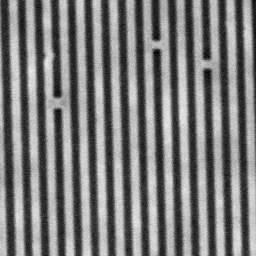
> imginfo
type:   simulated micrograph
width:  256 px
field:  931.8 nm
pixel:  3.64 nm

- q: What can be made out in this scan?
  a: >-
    parallel lines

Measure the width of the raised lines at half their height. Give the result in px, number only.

6.62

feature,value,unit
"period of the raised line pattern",0.0608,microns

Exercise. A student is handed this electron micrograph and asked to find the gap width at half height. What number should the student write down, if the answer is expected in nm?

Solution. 37.3